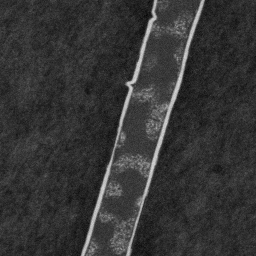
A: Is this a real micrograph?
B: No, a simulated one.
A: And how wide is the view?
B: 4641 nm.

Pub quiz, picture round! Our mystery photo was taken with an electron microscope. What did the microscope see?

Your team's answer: one or a few lines or trenches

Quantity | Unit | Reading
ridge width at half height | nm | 774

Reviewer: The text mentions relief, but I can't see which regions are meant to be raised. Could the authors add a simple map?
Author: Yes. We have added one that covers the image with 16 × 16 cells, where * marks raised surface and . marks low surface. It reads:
..........***...
.........***....
.........***....
.........***....
.........**.....
........***.....
........***.....
........**......
.......***......
.......***......
.......***......
.......**.......
......***.......
......***.......
......**........
.....***........